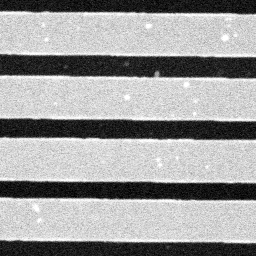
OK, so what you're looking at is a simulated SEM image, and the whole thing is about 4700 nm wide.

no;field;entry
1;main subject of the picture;lines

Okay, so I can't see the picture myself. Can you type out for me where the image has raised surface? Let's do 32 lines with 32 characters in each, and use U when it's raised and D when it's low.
DDDDDDDDDDDDDDDDDDDDDDDDDDDDDDDD
DDDDDDDDDDDDDDDDDDDDDDDDDDDDDDDD
UUUUUUUUUUUUUUUUUUUUUUUUUUUUUUUU
UUUUUUUUUUUUUUUUUUUUUUUUUUUUUUUU
UUUUUUUUUUUUUUUUUUUUUUUUUUUUUUUU
UUUUUUUUUUUUUUUUUUUUUUUUUUUUUUUU
UUUUUUUUUUUUUUUUUUUUUUUUUUUUUUUU
DDDDDDDDDDDDDDDDDDDDDDDDDDDDDDDD
DDDDDDDDDDDDDDDDDDDDDDDDDDDDDDDD
DDDDDDDDDDDDDDDDDDDDDDDDDDDDDDDD
UUUUUUUUUUUUUUUUUUUUUUUUUUUUUUUU
UUUUUUUUUUUUUUUUUUUUUUUUUUUUUUUU
UUUUUUUUUUUUUUUUUUUUUUUUUUUUUUUU
UUUUUUUUUUUUUUUUUUUUUUUUUUUUUUUU
UUUUUUUUUUUUUUUUUUUUUUUUUUUUUUUU
DDDDDDDDDDDDDDDDDDDDDDDDDDDDDDDD
DDDDDDDDDDDDDDDDDDDDDDDDDDDDDDDD
UUUUUUUUUUUUUUUUUUUUUUUUUDDDDDDD
UUUUUUUUUUUUUUUUUUUUUUUUUUUUUUUU
UUUUUUUUUUUUUUUUUUUUUUUUUUUUUUUU
UUUUUUUUUUUUUUUUUUUUUUUUUUUUUUUU
UUUUUUUUUUUUUUUUUUUUUUUUUUUUUUUU
DDDDUUUUUUUUUUUUUUUUUUUUUUUUUUUU
DDDDDDDDDDDDDDDDDDDDDDDDDDDDDDDD
DDDDDDDDDDDDDDDDDDDDDDDDDDDDDDDD
UUUUUUUUUUUUUUUUUUUUUUUUUUUUUUUU
UUUUUUUUUUUUUUUUUUUUUUUUUUUUUUUU
UUUUUUUUUUUUUUUUUUUUUUUUUUUUUUUU
UUUUUUUUUUUUUUUUUUUUUUUUUUUUUUUU
UUUUUUUUUUUUUUUUUUUUUUUUUUUUUUUU
DDDDDDDDDDDDDDDDDDDDDDDDDDDDDDDD
DDDDDDDDDDDDDDDDDDDDDDDDDDDDDDDD